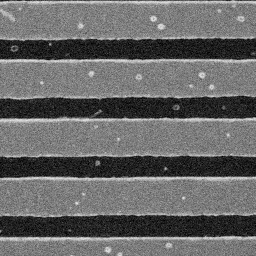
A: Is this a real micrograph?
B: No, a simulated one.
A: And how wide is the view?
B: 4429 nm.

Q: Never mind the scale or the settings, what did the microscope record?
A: lines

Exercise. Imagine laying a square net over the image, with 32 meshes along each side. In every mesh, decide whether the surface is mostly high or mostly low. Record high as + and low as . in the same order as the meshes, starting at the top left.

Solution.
++++++++++++++++++++++++++++++++
++++++++++++++++++++++++++++++++
++++++++++++++++++++++++++++++++
++++++++++++++++++++++++++++++++
++++++++++++++++++++++++++++++++
................................
................................
................................
++++++++++++++++++++++++++++++++
++++++++++++++++++++++++++++++++
++++++++++++++++++++++++++++++++
++++++++++++++++++++++++++++++++
................................
................................
................................
++++++++++++++++++++++++++++++++
++++++++++++++++++++++++++++++++
++++++++++++++++++++++++++++++++
++++++++++++++++++++++++++++++++
+++.+...........................
................................
................................
++++++++++++++++++++++++++++++++
++++++++++++++++++++++++++++++++
++++++++++++++++++++++++++++++++
++++++++++++++++++++++++++++++++
++++++++++++++++++++++++++++++++
................................
................................
................................
++++++++++++++++++++++++++++++++
++++++++++++++++++++++++++++++++